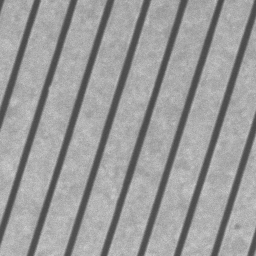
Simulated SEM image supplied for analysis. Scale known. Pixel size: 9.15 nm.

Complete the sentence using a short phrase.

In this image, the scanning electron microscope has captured parallel lines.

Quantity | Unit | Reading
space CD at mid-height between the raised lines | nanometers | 69.8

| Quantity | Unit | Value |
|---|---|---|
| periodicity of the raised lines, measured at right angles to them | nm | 320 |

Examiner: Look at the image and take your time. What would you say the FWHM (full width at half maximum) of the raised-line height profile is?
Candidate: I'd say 251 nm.